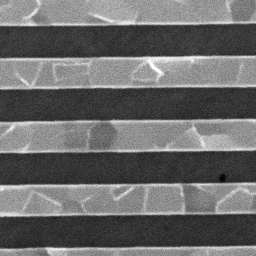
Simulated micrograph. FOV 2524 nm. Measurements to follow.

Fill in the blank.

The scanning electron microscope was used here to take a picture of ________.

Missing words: wiring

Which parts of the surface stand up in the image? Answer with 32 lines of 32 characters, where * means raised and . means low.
********************************
********************************
********************************
................................
................................
................................
................................
********************************
********************************
********************************
********************************
................................
................................
................................
................................
********************************
********************************
********************************
********************************
................................
................................
................................
................................
********************************
********************************
********************************
********************************
................................
................................
................................
................................
********************************